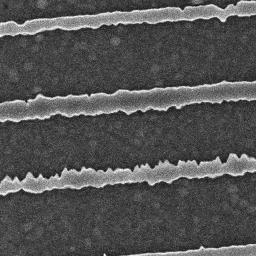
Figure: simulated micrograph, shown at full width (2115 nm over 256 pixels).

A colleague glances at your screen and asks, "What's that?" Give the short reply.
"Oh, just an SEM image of one or a few lines or trenches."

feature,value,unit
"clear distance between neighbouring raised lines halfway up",544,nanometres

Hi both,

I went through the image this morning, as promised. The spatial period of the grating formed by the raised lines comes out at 0.647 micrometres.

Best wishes